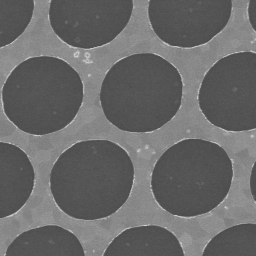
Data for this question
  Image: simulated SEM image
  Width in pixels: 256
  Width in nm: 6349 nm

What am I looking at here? holes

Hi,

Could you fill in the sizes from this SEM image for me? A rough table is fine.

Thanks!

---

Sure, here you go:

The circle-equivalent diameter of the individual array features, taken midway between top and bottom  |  2000 nm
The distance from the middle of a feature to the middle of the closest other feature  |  2.44 microns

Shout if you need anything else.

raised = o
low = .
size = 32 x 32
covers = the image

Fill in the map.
....oo...........oo..........oo.
....oo...........o...........oo.
....oo..........ooo..........oo.
...oooo.........ooo.........oooo
..ooooo........ooooo.......ooooo
.ooooooo.....oooooooo....ooooooo
oooooooooooooooooooooooooooooo.o
ooo.....ooooooo......oooooo.....
oo.......ooooo........oooo......
o.........ooo..........ooo......
o.........ooo..........oo.......
..........ooo..........oo.......
..........ooo..........oo.......
o.........ooo.........ooo.......
o........oooo.........oooo......
oo.......ooooo.......oooooo.....
ooo....oooooooooo..ooooooooooooo
ooooooooooo..oooooooooo..ooooooo
..ooooooo......oooooo.......oooo
...oooo.........oooo.........ooo
....ooo..........oo..........ooo
....oo...........oo..........oo.
....oo...........oo..........oo.
....oo..........ooo..........oo.
....ooo.........ooo.........oooo
...oooo........ooooo.......ooooo
..oooooo......ooooooo.....oooooo
oooooooooo..oooooooooooooooooooo
ooooo...ooooooooo....ooooooo....
oo.......oooooo.......ooooo.....
o.........oooo.........ooo......
o.........ooo..........oo.......